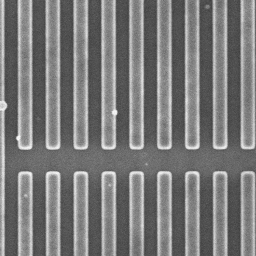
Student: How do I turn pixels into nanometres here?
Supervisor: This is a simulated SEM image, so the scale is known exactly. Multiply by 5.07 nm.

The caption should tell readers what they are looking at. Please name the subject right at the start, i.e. groups of lines, slits or small figures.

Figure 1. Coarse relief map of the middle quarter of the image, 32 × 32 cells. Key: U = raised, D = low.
DDDUUUDDDDUUUDDDDUUUDDDDUUUDDDUU
DDDUUUDDDDUUUDDDDUUUDDDDUUUDDDUU
DDDUUUDDDDUUUDDDDUUUDDDDUUUDDDUU
DDDUUUDDDDUUUDDDDUUUDDDDUUUDDDUU
DDDUUUDDDDUUUDDDDUUUDDDDUUUDDDUU
DDDUUUDDDDUUUDDDDUUUDDDDUUUDDDUU
DDDUUUDDDDUUUDDDDUUUDDDDUUUDDDUU
DDDUUUDDDDUUUDDDDUUUDDDDUUUDDDUU
DDDUUUDDDDUUUDDDDUUUDDDDUUUDDDUU
DDDUUUDDDDUUUDDDDUUUDDDDUUUDDDUU
DDDUUUDDDDUUUDDDDUUUDDDDUUUDDDUU
DDDUUUDDDDUUUDDDDUUUDDDDUUUDDDUU
DDDUUUDDDDUUUDDDDUUUDDDDUUUDDDUU
DDDUUUDDDDUUUDDDDUUUDDDDUUUDDDUU
DDDUUUDDDDUUUDDDDUUUDDDDUUUDDDUU
DDDUUUDDDDUUUDDDDUUUDDDDUUUDDDUU
DDDUUUDDDDUUUDDDDUUUDDDDUUUDDDUU
DDDUUUDDDDUUUDDDDUUUDDDDUUUDDDUU
DDDUUUDDDDUUUDDDDUUUDDDDUUUDDDUU
DDDUUUDDDDUUUDDDDUUUDDDDUUUDDDUU
DDDUUUDDDDUUUDDDDUUUDDDDUUUDDDDU
DDDDDDDDDDDDDDDDDDDDDDDDDDDDDDDD
DDDDDDDDDDDDDDDDDDDDDDDDDDDDDDDD
DDDDDDDDDDDDDDDDDDDDDDDDDDDDDDDD
DDDDDDDDDDDDDDDDDDDDDDDDDDDDDDDD
DDDDDDDDDDDDDDDDDDDDDDDDDDDDDDDD
DDDDDDDDDDDDDDDDDDDDDDDDDDDDDDDD
DDDUUDDDDDUUDDDDDUUDDDDDUUDDDDDU
DDDUUUDDDDUUUDDDDUUUDDDDUUUDDDDU
DDDUUUDDDDUUUDDDDUUUDDDDUUUDDDDU
DDDUUUDDDDUUUDDDDUUUDDDDUUUDDDDU
DDDUUUDDDDUUUDDDDUUUDDDDUUUDDDDU